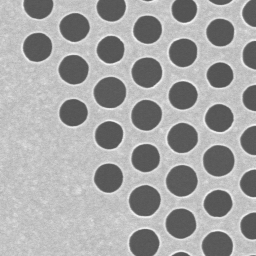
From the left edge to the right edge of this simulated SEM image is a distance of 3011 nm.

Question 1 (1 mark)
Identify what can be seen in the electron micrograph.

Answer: a regular array of holes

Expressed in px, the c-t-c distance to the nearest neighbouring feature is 42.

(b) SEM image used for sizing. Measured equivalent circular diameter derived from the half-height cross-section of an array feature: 342 nm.